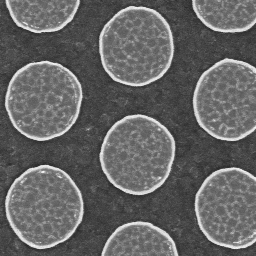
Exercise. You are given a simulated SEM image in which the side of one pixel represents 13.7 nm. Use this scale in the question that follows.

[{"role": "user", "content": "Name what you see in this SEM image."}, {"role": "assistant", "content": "raised bodies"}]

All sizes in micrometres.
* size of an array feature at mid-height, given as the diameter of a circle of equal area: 1.03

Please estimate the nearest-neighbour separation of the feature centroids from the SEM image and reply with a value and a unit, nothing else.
107 px